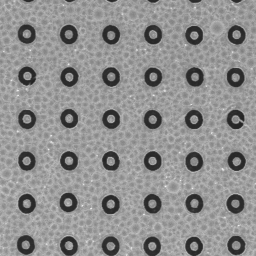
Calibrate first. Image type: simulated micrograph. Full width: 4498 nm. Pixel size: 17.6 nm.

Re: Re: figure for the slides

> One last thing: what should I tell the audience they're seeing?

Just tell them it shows a regular array of ring-shaped grooves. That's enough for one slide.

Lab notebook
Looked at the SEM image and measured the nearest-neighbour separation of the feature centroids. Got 729 nm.